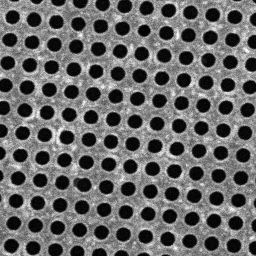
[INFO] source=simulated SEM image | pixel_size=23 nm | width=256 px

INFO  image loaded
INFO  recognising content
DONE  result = a regular array of holes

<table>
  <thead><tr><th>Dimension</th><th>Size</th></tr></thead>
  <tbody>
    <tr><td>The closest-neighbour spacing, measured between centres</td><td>507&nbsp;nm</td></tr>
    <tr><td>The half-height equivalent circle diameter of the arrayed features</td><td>344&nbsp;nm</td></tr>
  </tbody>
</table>